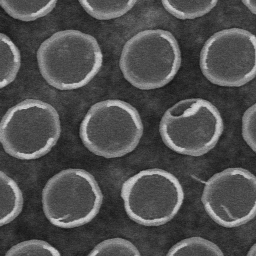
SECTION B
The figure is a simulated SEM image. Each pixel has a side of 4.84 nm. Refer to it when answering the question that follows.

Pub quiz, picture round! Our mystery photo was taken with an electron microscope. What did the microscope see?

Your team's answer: raised bodies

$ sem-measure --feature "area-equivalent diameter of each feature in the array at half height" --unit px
57.2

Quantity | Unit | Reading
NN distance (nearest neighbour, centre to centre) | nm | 385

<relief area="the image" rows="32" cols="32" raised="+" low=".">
+++++++...++++++.....++++++....+
.+++++.....++++.......++++......
................................
................................
.......++++......++++......+++++
++....++++++....++++++....++++++
++...+++++++...+++++++...+++++++
++...++++++++..+++++++...+++++++
++...+++++++...+++++++...+++++++
++....++++++....++++++....++++++
+......++++......+++........++..
................................
................................
..++++......++++.......++++.....
.++++++....++++++....++++++....+
+++++++...+++++++...++++++++...+
+++++++...++++++++..+++++++....+
+++++++...+++++++....++++++....+
.+++++.....+++++......++++......
..+++...........................
................................
........++.......+++........+++.
+.....+++++.....++++++....++++++
++....++++++...++++++++...++++++
++...+++++++...++++++++..+++++++
++...+++++++....+++++++...++++++
++....++++++....++++++....++++++
+.....+++++......++++......++++.
................................
................................
...+++.......+++......++++......
.++++++.....+++++....++++++....+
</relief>